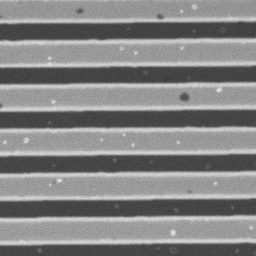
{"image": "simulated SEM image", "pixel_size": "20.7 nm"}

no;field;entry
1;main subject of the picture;lines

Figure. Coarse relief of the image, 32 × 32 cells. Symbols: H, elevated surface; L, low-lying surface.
HHHHHHHHHHHHHHHHHHHHHHHHHHHHHHHH
HHHHHHHHHHHHHHHHHHHHHHHHHHHHHHHH
HHHHHHHHHHHHHHHHHHHHHHHHHHHHHHHH
LLLLLLLLLLLLLLLLLLLLLLLLLLLLLLLL
LLLLLLLLLLLLLLLLLLLLLLLLLLLLLLLL
HHHHHHHHHHHHHHHHHHHHHHHHHHHHHHHH
HHHHHHHHHHHHHHHHHHHHHHHHHHHHHHHH
HHHHHHHHHHHHHHHHHHHHHHHHHHHHHHHH
LLLLLLLLLLLLLLLLLLLLLLLLLLLLLLLL
LLLLLLLLLLLLLLLLLLLLLLLLLLLLLLLL
LLLLLLLLLLHHHHHHHHHHHHHHHHHHHHHH
HHHHHHHHHHHHHHHHHHHHHHHHHHHHHHHH
HHHHHHHHHHHHHHHHHHHHHHHHHHHHHHHH
HHHHHHHHHHHHHHHHHHHHHHHHHHHHHHHH
LLLLLLLLLLLLLLLLLLLLLLLLLLLLLLLL
LLLLLLLLLLLLLLLLLLLLLLLLLLLLLLLL
HHHHHHHHHHHHHHHHHHHHHHHHHHHHHHHH
HHHHHHHHHHHHHHHHHHHHHHHHHHHHHHHH
HHHHHHHHHHHHHHHHHHHHHHHHHHHHHHHH
LLLLLLLLLLLLLLLLLLLLLLLLLLLLLLLL
LLLLLLLLLLLLLLLLLLLLLLLLLLLLLLLL
LLLLLLLLLLLLLLLLLLLLLLLLLLLLLLLL
HHHHHHHHHHHHHHHHHHHHHHHHHHHHHHHH
HHHHHHHHHHHHHHHHHHHHHHHHHHHHHHHH
HHHHHHHHHHHHHHHHHHHHHHHHHHHHHHHH
LLLLLLLLLLLLLLLLLLLLLLLLLLLLLLLL
LLLLLLLLLLLLLLLLLLLLLLLLLLLLLLLL
HHHHHHHHHHHHHHHHHHHHHHHHHHHHHHHH
HHHHHHHHHHHHHHHHHHHHHHHHHHHHHHHH
HHHHHHHHHHHHHHHHHHHHHHHHHHHHHHHH
HHHLLLLLLLLLLLLLLLLLLLLLLLLLLLLL
LLLLLLLLLLLLLLLLLLLLLLLLLLLLLLLL